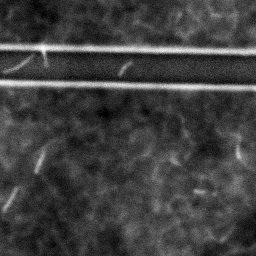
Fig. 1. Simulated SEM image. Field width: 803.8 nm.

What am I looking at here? one or a few lines or trenches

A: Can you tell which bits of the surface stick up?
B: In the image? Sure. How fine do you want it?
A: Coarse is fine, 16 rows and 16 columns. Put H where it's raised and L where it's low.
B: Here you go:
HHHHHHHHHHHHHHHH
HHHHHHHHHHHHHHHH
HHHHHHHHHHHHHHHH
LLLLLLLLLLLLLLLL
LLLLLLLLLLLLLLLL
HHHHHHHHHHHHHHLL
HHHHHHHHHHHHHHHH
HHHHHHHHHHHHHHHH
HHHHHHHHHHHHHHHH
HHHHHHHHHHHHHHHH
HHHHHHHHHHHHHHHH
HHHHHHHHHHHHHHHH
HHHHHHHHHHHHHHHH
HHHHHHHHHHHHHHHH
HHHHHHHHHHHHHHHH
HHHHHHHHHHHHHHHH